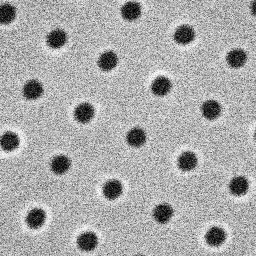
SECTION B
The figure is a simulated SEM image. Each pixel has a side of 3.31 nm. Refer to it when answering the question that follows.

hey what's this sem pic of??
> a regular array of holes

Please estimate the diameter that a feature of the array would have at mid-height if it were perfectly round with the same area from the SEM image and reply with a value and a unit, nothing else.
73.9 nm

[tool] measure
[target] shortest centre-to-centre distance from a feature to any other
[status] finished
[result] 185 nm